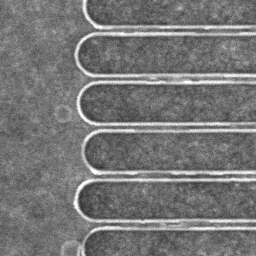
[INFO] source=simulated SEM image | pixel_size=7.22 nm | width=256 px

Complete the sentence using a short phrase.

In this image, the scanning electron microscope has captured parallel lines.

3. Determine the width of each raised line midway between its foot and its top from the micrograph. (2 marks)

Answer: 70.4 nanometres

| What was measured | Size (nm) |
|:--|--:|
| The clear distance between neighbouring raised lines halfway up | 280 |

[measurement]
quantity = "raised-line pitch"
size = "351 nanometres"